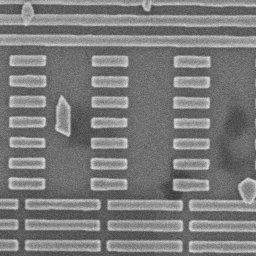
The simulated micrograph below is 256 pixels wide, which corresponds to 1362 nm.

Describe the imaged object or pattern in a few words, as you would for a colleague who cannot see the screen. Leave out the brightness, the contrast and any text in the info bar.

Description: wiring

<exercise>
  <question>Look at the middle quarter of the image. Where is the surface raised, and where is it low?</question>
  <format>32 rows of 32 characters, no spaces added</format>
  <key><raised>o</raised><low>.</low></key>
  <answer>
............................oooo
................................
................................
.......ooooooooo...............o
.......ooooooooo............oooo
........oooooooo............oooo
................................
................................
.......ooooooooo................
o......ooooooooo...........ooooo
o......ooooooooo...........ooooo
o...............................
o...............................
o...............................
o......ooooooooo............oooo
o......oooooooo.............oooo
o...............................
o...............................
................................
.......ooooooooo...........ooooo
.......ooooooooo...........ooooo
................................
................................
................................
.......ooooooooo...........ooooo
.......ooooooooo...........ooooo
................................
................................
................................
.......ooooooooo...........ooooo
.......ooooooooo...........ooooo
..............................oo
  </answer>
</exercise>